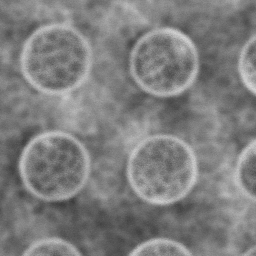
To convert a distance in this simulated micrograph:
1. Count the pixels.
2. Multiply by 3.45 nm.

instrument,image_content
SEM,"raised bodies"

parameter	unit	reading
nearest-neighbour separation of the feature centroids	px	107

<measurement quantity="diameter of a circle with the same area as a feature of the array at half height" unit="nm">227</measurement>